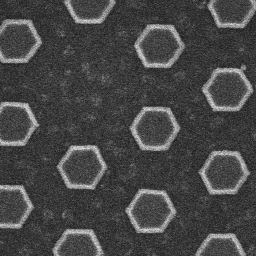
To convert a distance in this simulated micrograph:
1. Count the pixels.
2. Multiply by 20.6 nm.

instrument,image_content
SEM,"raised bodies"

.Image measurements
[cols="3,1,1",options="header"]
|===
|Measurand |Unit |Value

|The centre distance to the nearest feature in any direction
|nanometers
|1680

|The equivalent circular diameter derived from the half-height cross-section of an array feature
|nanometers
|871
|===